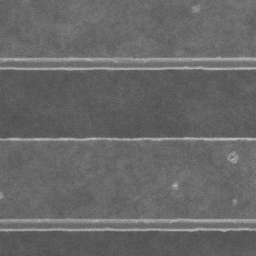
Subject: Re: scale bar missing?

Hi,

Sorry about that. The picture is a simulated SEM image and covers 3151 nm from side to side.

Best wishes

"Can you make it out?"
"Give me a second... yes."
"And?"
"lines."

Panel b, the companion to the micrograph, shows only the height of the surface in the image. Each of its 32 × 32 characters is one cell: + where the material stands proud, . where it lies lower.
++++++++++++++++++++++++++++++++
++++++++++++++++++++++++++++++++
++++++++++++++++++++++++++++++++
++++++++++++++++++++++++++++++++
++++++++++++++++++++++++++++++++
++++++++++++++++++++++++++++++++
++++++++++++++++++++++++++++++++
++++++++++++++++++++++++++++++++
++++++++++++++++++++++++++++++++
................................
................................
................................
................................
................................
................................
................................
................................
.++..+++++++++++++++++++++++++++
++++++++++++++++++++++++++++++++
++++++++++++++++++++++++++++++++
++++++++++++++++++++++++++++++++
++++++++++++++++++++++++++++++++
++++++++++++++++++++++++++++++++
++++++++++++++++++++++++++++++++
++++++++++++++++++++++++++++++++
++++++++++++++++++++++++++++++++
++++++++++++++++++++++++++++++++
++++++++++++++++++++++++++++++++
++++++++++++++++++++++++++++++++
................................
................................
................................